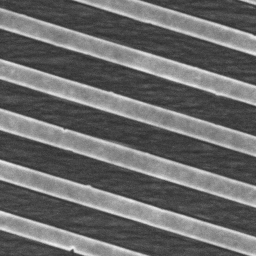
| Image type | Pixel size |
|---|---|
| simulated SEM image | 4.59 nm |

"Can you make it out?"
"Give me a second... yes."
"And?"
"parallel lines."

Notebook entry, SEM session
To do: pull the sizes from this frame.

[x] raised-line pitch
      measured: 222 nm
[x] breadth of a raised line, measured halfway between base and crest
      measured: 85 nm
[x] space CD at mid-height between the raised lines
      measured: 134 nm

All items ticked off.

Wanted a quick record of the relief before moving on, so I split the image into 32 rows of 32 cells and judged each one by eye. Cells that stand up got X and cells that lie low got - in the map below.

-----------XXXXXXXX-------------
XX------------XXXXXXXX----------
XXXXX------------XXXXXXXXX------
XXXXXXXX-------------XXXXXXXX---
---XXXXXXXX-------------XXXXXXXX
------XXXXXXXX-------------XXXXX
----------XXXXXXXX-------------X
-------------XXXXXXXX-----------
XXXX------------XXXXXXXXX-------
XXXXXXX-------------XXXXXXXX----
--XXXXXXXX-------------XXXXXXXX-
------XXXXXXXX------------XXXXXX
---------XXXXXXXX-------------XX
------------XXXXXXXX------------
XXX-------------XXXXXXX---------
XXXXXX-------------XXXXXXXX-----
-XXXXXXXX-------------XXXXXXXX--
----XXXXXXXXX------------XXXXXXX
--------XXXXXXXX-------------XXX
-----------XXXXXXXX-------------
XX------------XXXXXXXXX---------
XXXXX-------------XXXXXXXX------
XXXXXXXX-------------XXXXXXXX---
----XXXXXXXX------------XXXXXXXX
-------XXXXXXXX------------XXXXX
----------XXXXXXXX-------------X
-------------XXXXXXXX-----------
XXXX-------------XXXXXXXX-------
XXXXXXX-------------XXXXXXXX----
---XXXXXXX-------------XXXXXXXX-
------XXXXXXXX-------------XXXXX
----------XXXXXXX-------------XX